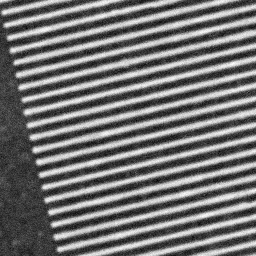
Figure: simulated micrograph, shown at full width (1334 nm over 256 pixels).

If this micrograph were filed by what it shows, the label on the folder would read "parallel lines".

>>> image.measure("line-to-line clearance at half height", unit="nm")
44.4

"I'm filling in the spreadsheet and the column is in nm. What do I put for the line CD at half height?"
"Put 22.2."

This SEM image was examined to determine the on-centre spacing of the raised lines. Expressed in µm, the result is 0.0667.